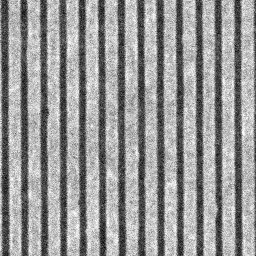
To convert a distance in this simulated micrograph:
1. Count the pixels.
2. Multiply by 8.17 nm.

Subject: parallel lines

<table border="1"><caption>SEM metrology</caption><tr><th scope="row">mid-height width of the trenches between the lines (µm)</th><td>0.0623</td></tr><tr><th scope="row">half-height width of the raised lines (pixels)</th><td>12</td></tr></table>